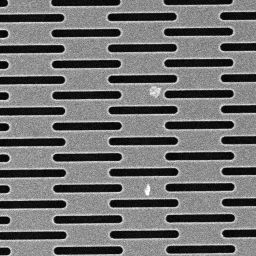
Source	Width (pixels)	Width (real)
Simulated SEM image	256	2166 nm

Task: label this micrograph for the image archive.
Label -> groups of lines, slits or small figures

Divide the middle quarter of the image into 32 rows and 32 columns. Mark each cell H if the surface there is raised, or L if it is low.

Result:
LLLLLLLLLLLLLLHHHHHHHHHHHLLLLLLL
HHHHHHHHHHHHHHHHHHHHHHHHHHHHHHHH
HHHHHHHHHHHHHHHHHHHHHHHHHHHHHHHH
HHHHHHHHHHHLLLLLLLLLLLLLLLLLHHHH
HHHHHHHHHHHLLLLLLLLLLLLLLLLLHHHH
HHHHHHHHHHHHHHHHHHHHHHHHHHHHHHHH
HHHHHHHHHHHHHHHHHHHHHHHHHHHHHHHH
LLLLLLLLLLLLLLHHHHHHHHHHHLLLLLLL
LLLLLLLLLLLLLLHHHHHHHHHHHHLLLLLL
HHHHHHHHHHHHHHHHHHHHHHHHHHHHHHHH
HHHHHHHHHHHHLLLLLLLLLLLLLLLLHHHH
HHHHHHHHHHHLLLLLLLLLLLLLLLLLHHHH
HHHHHHHHHHHHLLLLLLLLLLLLLLLLHHHH
HHHHHHHHHHHHHHHHHHHHHHHHHHHHHHHH
LLLLLLLLLLLLLLHHHHHHHHHHHHLLLLLL
LLLLLLLLLLLLLLLHHHHHHHHHHLLLLLLL
LLLLLLLLLLLLLLHHHHHHHHHHHHLLLLLL
HHHHHHHHHHHHHHHHHHHHHHHHHHHHHHHH
HHHHHHHHHHHHLLLLLLLLLLLLLLLLHHHH
HHHHHHHHHHHLLLLLLLLLLLLLLLLLHHHH
HHHHHHHHHHHHHHHHHHHHHHHHHHHHHHHH
HHHHHHHHHHHHHHHHHHHHHHHHHHHHHHHH
LLLLLLLLLLLLLLHHHHHHHHHHHLLLLLLL
LLLLLLLLLLLLLLHHHHHHHHHHHLLLLLLL
LLHHHHHHHHHHHHHHHHHHHHHHHHHHHHHH
HHHHHHHHHHHHHHHHHHHHHHHHHHHHHHHH
HHHHHHHHHHHHLLLLLLLLLLLLLLLLHHHH
HHHHHHHHHHHLLLLLLLLLLLLLLLLLHHHH
HHHHHHHHHHHHHHHHHHHHHHHHHHHHHHHH
HHHHHHHHHHHHHHHHHHHHHHHHHHHHHHHH
LLLLLLLLLLLLLLLHHHHHHHHHHLLLLLLL
LLLLLLLLLLLLLLLHHHHHHHHHHLLLLLLL